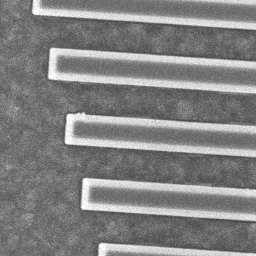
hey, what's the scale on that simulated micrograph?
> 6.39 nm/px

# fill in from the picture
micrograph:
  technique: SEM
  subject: parallel lines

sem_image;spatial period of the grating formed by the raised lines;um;0.409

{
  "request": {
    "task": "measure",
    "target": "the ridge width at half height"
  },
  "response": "26 px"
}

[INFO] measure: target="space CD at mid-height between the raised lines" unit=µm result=0.243